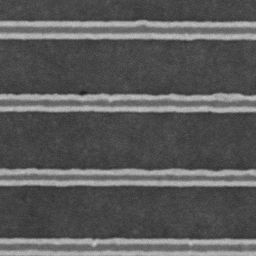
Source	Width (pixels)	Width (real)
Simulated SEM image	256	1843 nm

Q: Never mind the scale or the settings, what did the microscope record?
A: one or a few lines or trenches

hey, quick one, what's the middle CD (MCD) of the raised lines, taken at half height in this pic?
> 85.4 nanometres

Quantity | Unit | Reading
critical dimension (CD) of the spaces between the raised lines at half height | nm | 439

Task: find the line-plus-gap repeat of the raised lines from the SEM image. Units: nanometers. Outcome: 522